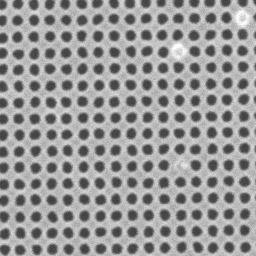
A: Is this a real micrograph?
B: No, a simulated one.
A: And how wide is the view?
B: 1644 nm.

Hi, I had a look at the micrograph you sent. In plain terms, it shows a regular array of holes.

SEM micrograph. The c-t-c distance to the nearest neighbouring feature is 101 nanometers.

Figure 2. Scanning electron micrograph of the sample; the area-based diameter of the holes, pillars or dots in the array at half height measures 73.9 nm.